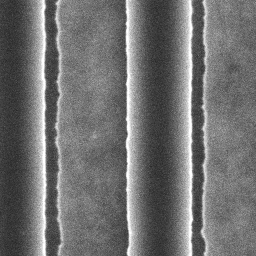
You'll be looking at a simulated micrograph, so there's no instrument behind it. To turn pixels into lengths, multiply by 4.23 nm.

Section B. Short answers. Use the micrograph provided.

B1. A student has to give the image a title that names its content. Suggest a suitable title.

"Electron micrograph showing lines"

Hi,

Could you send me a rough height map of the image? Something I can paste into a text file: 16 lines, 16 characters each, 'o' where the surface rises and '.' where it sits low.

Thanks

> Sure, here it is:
ooo.....oooo....
ooo.....oooo....
ooo.....oooo....
ooo.....oooo....
ooo.....oooo....
ooo.....oooo....
ooo.....oooo....
ooo.....oooo....
ooo.....oooo....
ooo.....oooo....
ooo.....oooo....
ooo.....oooo....
ooo.....oooo....
ooo.....oooo....
ooo.....oooo....
ooo.....oooo....